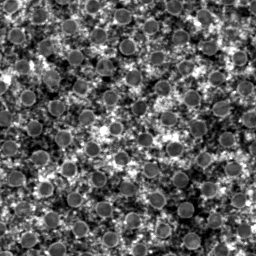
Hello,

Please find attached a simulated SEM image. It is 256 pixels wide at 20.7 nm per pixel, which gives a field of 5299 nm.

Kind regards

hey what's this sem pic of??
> a regular array of raised bodies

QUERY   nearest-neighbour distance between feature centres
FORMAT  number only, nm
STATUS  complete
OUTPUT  629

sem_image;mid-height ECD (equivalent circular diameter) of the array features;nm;325